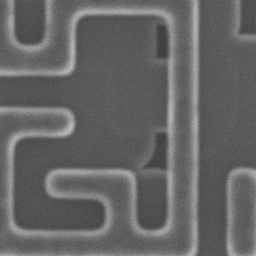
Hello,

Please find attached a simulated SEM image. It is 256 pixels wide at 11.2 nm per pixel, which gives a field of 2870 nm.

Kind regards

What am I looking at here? wiring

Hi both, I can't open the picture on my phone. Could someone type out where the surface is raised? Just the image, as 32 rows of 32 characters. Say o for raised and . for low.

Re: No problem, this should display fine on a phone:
o.....oooooooooooooooooo........
o.....oooooooooooooooooo........
o.....ooo............ooo........
oo....ooo............ooo........
oo....ooo............ooo........
oo...oooo............ooo........
ooooooooo............ooo........
ooooooooo............ooo........
ooooooooo............ooo........
.....................ooo........
.....................ooo........
.....................ooo........
.....................ooo........
.....................ooo........
ooooooooo............ooo........
ooooooooo............ooo........
ooooooooo............ooo........
oo...................ooo........
oo...................ooo........
o....................ooo........
o....................ooo........
o......ooooooooo.....ooo.....ooo
o.....ooooooooooo....ooo.....ooo
o.....ooooooooooo....ooo.....ooo
o......oooooooooo....ooo.....ooo
o............oooo....ooo.....ooo
o............oooo....ooo.....ooo
oo...........oooo....ooo.....ooo
oo...........oooo....ooo.....ooo
oooooooooooooooooooooooo.....ooo
oooooooooooooooooooooooo.....ooo
oooooooooooooooooooooooo.....ooo